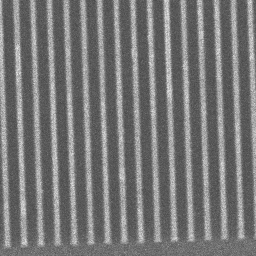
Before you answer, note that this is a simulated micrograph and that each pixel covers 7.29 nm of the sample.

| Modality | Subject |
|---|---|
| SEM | parallel lines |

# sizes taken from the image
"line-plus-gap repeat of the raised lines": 16.7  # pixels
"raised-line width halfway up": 53.7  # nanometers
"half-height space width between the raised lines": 0.0738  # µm